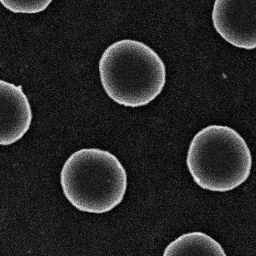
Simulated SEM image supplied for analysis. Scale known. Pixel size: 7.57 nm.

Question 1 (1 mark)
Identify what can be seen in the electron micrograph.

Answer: raised bodies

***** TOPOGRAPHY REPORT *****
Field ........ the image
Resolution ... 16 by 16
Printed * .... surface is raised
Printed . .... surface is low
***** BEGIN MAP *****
***..........***
.............***
..............**
......****......
......****......
*......***......
**......*.......
**..............
*...........***.
.....**.....****
....****....****
....****.....**.
....***.........
................
................
..........****..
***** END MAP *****